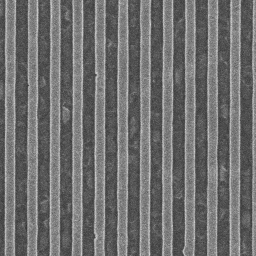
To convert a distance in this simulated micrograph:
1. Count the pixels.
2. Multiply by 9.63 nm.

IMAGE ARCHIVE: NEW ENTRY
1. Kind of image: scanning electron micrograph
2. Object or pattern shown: parallel lines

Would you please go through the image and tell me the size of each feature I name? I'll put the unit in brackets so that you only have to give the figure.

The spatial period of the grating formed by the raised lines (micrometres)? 0.217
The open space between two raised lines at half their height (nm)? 124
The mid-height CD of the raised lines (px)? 9.25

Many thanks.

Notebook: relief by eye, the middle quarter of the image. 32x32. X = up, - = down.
--XX----XX----XX---XX----XX---XX
--XX----XX----XX---XX----XX----X
--XX----XX----XX---XX----XX----X
--XX----XX----XX---XX----XX---XX
--XX----XX----XX---XX----XX----X
--XX----XX----XX---XX----XX----X
--XX----XX----XX---XX----XX----X
--XX----XX----XX---XX----XX----X
--XX----XX----XX---XX----XX----X
--XX----XX----XX---XX----XX---XX
--XX----XX----XX---XX----XX---XX
--XX----XX----XX---XX----XX---XX
--XX----XX----XX---XX----XX----X
--XX----XX----XX---XX----XX----X
--XX----XX----XX---XX----XX----X
--XX----XX----XX---XX----XX---XX
--XX----XX----XX---XX----XX---XX
--XX----XX----XX---XX----XX----X
--XX----XX----XX---XX----XX----X
--XX----XX----XX---XX----XX---XX
--XX----XX----XX---XX----XX---XX
--XX----XX----XX---XX----XX---XX
--XX----XX----XX---XX----XX---XX
--XX----XX----XX---XX----XX---XX
--XX----XX----XX---XX----XX----X
--XX----XX----XX---XX----XX---XX
--XX----XX----XX---XX----XX---XX
--XX----XX----XX---XX----XX---XX
--XX----XX----XX---XX----XX----X
--XX----XX----XX---XX----XX---XX
--XX----XX----XX---XX----XX----X
--XX----XX----XX---XX----XX----X